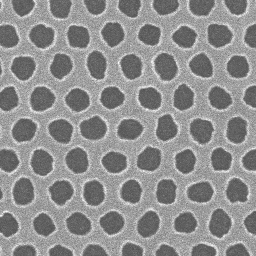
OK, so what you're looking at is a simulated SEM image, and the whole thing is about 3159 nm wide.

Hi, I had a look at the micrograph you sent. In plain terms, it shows a regular array of holes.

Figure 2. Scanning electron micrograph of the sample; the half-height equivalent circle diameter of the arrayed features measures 289 nm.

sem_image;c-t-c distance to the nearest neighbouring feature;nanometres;420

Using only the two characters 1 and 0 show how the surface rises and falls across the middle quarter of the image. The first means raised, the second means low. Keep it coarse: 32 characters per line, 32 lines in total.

00111100000111000001111000001110
00111100001111000001111000001111
01111100001111100001111100001111
11111111001111110011111100011111
11111111111111111111111111111111
11111111111111111111111111111001
11000111110000111110000111110000
10000011100000011110000011100000
00000011100000011100000011100000
00000011100000011110000011100000
10000011110000111110000011110000
11000111111111111111111111111011
11111111111111111111111110111111
11111110011111111111111100011111
01110000001111000001111000011111
00110000000111000000111000001110
00110000000110000000111000001110
00110000001110000001111000001111
00111000011111000011111000011111
01111111111111111111111111111111
11111111111111111111111111111111
11000111111111111111000011111100
10000011111000111110000011110000
00000011110000001100000011110000
00000011100000001100000011110000
10000011110000001100000011110000
11000011111000011111000111110000
11101111111111111111111111111101
11111111111111111111111111111111
01111100011111100001111100001111
00111000001111100001111000001111
00111000001111000000111000001110